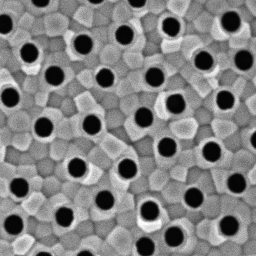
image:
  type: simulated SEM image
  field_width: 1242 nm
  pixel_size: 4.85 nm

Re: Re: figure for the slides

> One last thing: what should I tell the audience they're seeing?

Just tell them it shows a regular array of holes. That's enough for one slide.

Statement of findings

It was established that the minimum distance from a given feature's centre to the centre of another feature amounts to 194 nanometres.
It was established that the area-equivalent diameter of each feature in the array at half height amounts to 95.7 nanometers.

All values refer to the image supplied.